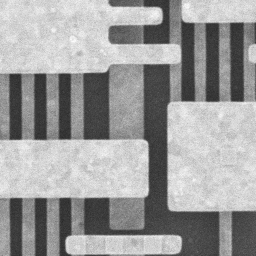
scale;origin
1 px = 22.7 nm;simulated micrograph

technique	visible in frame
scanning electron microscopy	wiring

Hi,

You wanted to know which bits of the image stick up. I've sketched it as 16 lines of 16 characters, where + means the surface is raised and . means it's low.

++++++++++.+++++
++++++++++......
+++++++.........
+++++++++++.....
+++++...........
................
...........+++++
...........+++++
...........+++++
+++++++++..+++++
+++++++++..+++++
+++++++++..+++++
...........+++++
................
................
....+++++++.....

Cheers